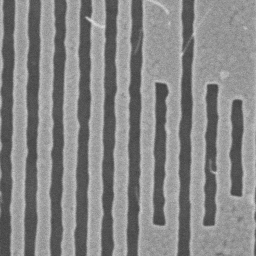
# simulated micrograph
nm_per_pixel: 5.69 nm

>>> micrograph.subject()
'groups of lines, slits or small figures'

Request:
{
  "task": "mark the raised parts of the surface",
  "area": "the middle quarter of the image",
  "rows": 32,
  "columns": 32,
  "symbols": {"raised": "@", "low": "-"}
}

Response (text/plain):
@@@@---@@@---@@@----@@@@@@@@@---
@@@@---@@@---@@@---@@@@@@@@@@---
@@@@---@@@---@@@---@@@@@@@@@@---
@@@@---@@@---@@@---@@@@@@@@@@---
@@@@---@@@---@@@---@@@@-@@@@@---
@@@@---@@@---@@@---@@@@---@@@---
@@@@---@@@---@@@---@@@@---@@@---
@@@@---@@@---@@@---@@@@---@@@---
@@@----@@@---@@@---@@@@---@@@---
@@@----@@@---@@@----@@@---@@@---
@@@----@@@---@@@----@@@---@@@---
@@@----@@@---@@@---@@@@---@@@---
@@@----@@@---@@@---@@@@---@@@---
@@@----@@@---@@@---@@@@---@@@---
@@@@--@@@@---@@@---@@@@---@@@---
@@@@--@@@@---@@@---@@@@--@@@@---
@@@@--@@@@---@@@---@@@@--@@@@---
@@@---@@@@---@@@---@@@@---@@----
@@@---@@@@---@@@---@@@----@@@---
@@@---@@@@---@@@---@@@----@@@---
@@@---@@@@---@@@---@@@----@@@---
@@@---@@@@---@@@---@@@----@@@---
@@@---@@@@---@@@---@@@----@@@---
@@@---@@@@---@@@---@@@----@@@---
@@@---@@@@---@@@---@@@---@@@@---
@@@---@@@----@@@---@@@---@@@@---
@@@---@@@----@@@---@@@---@@@@---
@@@---@@@----@@@---@@@----@@@---
@@@---@@@----@@@---@@@---@@@@---
@@@---@@@@---@@@---@@@---@@@@---
@@@---@@@@--@@@@---@@@---@@@@---
@@@---@@@@--@@@@---@@@---@@@@---